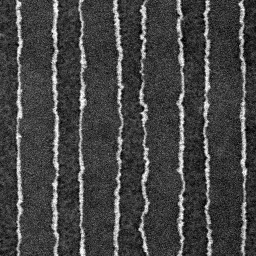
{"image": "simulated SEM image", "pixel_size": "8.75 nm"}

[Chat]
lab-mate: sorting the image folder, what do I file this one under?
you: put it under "one or a few lines or trenches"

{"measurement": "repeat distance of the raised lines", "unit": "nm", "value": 547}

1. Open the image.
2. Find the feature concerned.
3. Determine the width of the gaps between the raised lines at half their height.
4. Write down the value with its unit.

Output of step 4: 198 nm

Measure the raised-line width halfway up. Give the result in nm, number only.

340